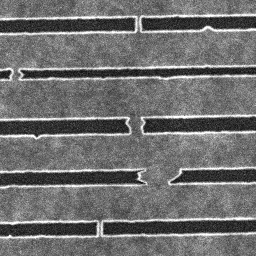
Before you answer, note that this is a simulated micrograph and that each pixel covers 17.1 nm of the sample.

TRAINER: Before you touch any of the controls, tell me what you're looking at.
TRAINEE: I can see parallel lines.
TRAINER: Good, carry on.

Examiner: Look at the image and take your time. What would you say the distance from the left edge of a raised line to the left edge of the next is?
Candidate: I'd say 0.87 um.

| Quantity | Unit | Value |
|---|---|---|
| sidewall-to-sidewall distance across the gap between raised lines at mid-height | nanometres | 254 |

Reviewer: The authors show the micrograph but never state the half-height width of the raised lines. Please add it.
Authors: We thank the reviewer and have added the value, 627 nm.